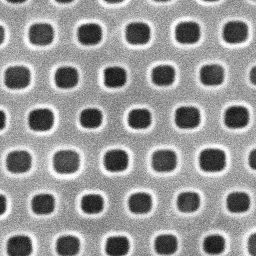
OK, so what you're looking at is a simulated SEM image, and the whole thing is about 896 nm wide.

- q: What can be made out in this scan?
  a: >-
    a regular array of holes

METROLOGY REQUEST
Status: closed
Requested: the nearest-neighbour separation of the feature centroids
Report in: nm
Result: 168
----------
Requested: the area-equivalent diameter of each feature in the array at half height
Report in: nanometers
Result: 94.8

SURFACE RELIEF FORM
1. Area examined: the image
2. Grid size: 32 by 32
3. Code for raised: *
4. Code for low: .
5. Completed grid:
*******..****..*****************
********************************
*****************************.**
.**....***...***...***...***...*
.**....**....**....***...***...*
****..****..****..****..****..**
********************************
********************************
*...***..****...***...***...***.
....***...***...***...***...***.
....***...***...***...***...***.
********************************
********************************
****..*****.*****.****...***...*
.**....***...***...***...***...*
.**....***...***...***...***...*
****.***************************
********************************
**************.***********.*****
*...**....***...***...***...***.
*...**....***...***...***...***.
*...***...***..****...***..*****
********************************
********************************
.***...***...***...***...***...*
.***...***...***...***...***...*
.***...***...***...***...****..*
********************************
********************************
*...***...**********..****..***.
*...***...***...***...***...***.
*...***...***...***...***...***.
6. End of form